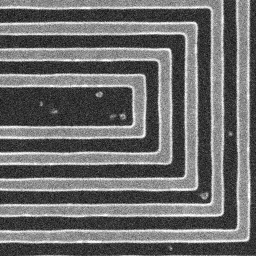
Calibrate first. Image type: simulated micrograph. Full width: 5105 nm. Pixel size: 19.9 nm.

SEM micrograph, groups of lines, slits or small figures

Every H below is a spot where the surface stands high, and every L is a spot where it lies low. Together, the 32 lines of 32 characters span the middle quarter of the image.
LLLLLLLLLLLLLLLLLLLLLLLLHHHLLLHH
LLLLLLLLLLLLLLLLLLLLLLLLHHHLLLHH
LLLLLLLLLLLLLLLLLLLLLLLLHHHLLLHH
HHHHHHHHHHHHHHHHHHHHLLLLHHHLLLHH
HHHHHHHHHHHHHHHHHHHHLLLLHHHLLLHH
HHHHHHHHHHHHHHHHHHHHLLLLHHHLLLHH
LLLLLLLLLLLLLLLLLHHHLLLLHHHLLLHH
LLLLLLLLLLLLLLLLLHHHLLLLHHHLLLHH
LLLLLLLLLLLLLLLLLHHHLLLLHHHLLLHH
LLLLLLLLLLLLLLLLLHHHLLLLHHHLLLHH
LLLLLLLLLLLLLLLLLHHHLLLLHHHLLLHH
LLLLLLLLLLLLLLLLLHHHLLLLHHHLLLHH
LLLLLLLLLLLLLLLLLHHHLLLLHHHLLLHH
LLLLLLLLLLLLLLLLLLHHLLLLHHHLLLHH
LLLLLLLLLLLLLLLLLLHHLLLLHHHLLLHH
LLLLLLLLLLLLLLLLLHHHLLLLHHHLLLHH
HHHHHHHHHHHHHHHHHHHHLLLLHHHLLLHH
HHHHHHHHHHHHHHHHHHHHLLLLHHHLLLHH
LLLHHHLLLLLLLLLLLLLLLLLLHHHLLLHH
LLLLLLLLLLLLLLLLLLLLLLLLHHHLLLHH
LLLLLLLLLLLLLLLLLLLLLLLLHHHLLLHH
LLLLLLLLLLLLLLLLLLLLLLLLHHHLLLHH
HHHHHHHHHHHHHHHHHHHHHHHHHHHLLLLH
HHHHHHHHHHHHHHHHHHHHHHHHHHHLLLLH
HHHHHHHHHHHHHHHHHHHHHHHHHHHLLLLH
LLLLLLLLLLLLLLLLLLLLLLLLLLLLLLLH
LLLLLLLLLLLLLLLLLLLLLLLLLLLLLLHH
LLLLLLLLLLLLLLLLLLLLLLLLLLLLLLHH
LLLLLLLLLLLLLLLLLLLLLLLLLLLLLHHH
HHHHHHHHHHHHHHHHHHHHHHHHHHHHHHHH
HHHHHHHHHHHHHHHHHHHHHHHHHHHHHHHH
LLLLLLLLLLLLLLLLLLLLLLHHLLLLLLLL